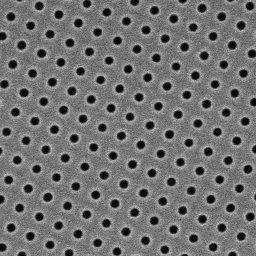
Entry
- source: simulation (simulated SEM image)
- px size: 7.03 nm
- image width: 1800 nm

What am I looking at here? a regular array of holes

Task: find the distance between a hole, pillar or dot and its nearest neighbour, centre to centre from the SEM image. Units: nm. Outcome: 149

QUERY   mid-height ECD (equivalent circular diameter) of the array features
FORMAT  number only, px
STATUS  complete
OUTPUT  8.59